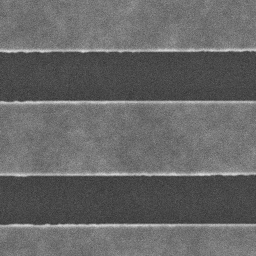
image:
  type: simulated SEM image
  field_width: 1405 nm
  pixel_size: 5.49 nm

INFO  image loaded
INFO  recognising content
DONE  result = lines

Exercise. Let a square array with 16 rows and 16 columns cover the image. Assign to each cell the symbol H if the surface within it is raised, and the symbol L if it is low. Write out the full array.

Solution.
HHHHHHHHHHHHHHHH
HHHHHHHHHHHHHHHH
HHHHHHHHHHHHHHHH
LLLLLLLLLLLLLLLL
LLLLLLLLLLLLLLLL
LLLLLLLLLLLLLLLL
HHHHHHHHHHHHHHHH
HHHHHHHHHHHHHHHH
HHHHHHHHHHHHHHHH
HHHHHHHHHHHHHHHH
HHHHHHHHHHHHHHHH
LLLLLLLLLLLLLLLL
LLLLLLLLLLLLLLLL
LLLLLLLLLLLLLLLL
HHHHHHHHHHHHHHHH
HHHHHHHHHHHHHHHH